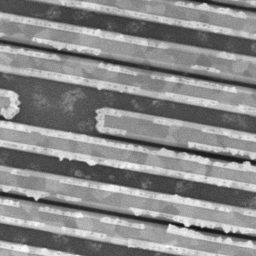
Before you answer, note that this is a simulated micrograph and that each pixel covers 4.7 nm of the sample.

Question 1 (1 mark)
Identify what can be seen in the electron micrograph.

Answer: parallel lines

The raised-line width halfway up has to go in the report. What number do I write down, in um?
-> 0.101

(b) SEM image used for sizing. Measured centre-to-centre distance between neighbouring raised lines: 176 nm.